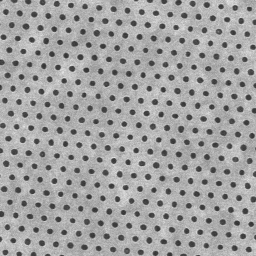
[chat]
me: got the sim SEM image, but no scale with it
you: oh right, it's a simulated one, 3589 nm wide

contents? a regular array of holes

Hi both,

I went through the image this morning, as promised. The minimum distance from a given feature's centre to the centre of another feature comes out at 196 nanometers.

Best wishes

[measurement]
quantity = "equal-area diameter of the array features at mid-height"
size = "86.7 nanometres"